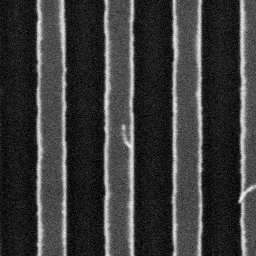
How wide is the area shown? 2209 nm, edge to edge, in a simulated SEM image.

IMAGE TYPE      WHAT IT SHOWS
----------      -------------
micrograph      lines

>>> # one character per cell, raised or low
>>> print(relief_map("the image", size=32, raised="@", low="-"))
-----@@@-----@@@@-----@@@-----@@
-----@@@-----@@@@-----@@@-----@@
-----@@@-----@@@@-----@@@-----@@
-----@@@-----@@@------@@@-----@@
-----@@@-----@@@@-----@@@-----@@
-----@@@-----@@@@-----@@@-----@@
-----@@@-----@@@@-----@@@-----@@
-----@@@-----@@@@-----@@@-----@@
-----@@@-----@@@@-----@@@-----@@
-----@@@-----@@@@-----@@@-----@@
-----@@@-----@@@@-----@@@-----@@
-----@@@-----@@@@-----@@@-----@@
-----@@@-----@@@@-----@@@-----@@
-----@@@-----@@@------@@@-----@@
-----@@@-----@@@@-----@@@-----@@
-----@@@-----@@@@-----@@@-----@@
-----@@@-----@@@@-----@@@-----@@
-----@@@-----@@@@-----@@@-----@@
-----@@@-----@@@@-----@@@-----@@
-----@@@-----@@@@-----@@@-----@@
-----@@@-----@@@@-----@@@-----@@
-----@@@-----@@@@-----@@@-----@@
-----@@@-----@@@@-----@@@-----@@
-----@@@-----@@@@-----@@@-----@@
-----@@@-----@@@@-----@@@-----@@
-----@@@-----@@@@-----@@@-----@@
-----@@@-----@@@@-----@@@-----@@
-----@@@-----@@@@-----@@@-----@@
-----@@@-----@@@@-----@@@-----@@
-----@@@-----@@@@-----@@@-----@@
-----@@@-----@@@@-----@@@-----@@
-----@@@-----@@@@-----@@@-----@@